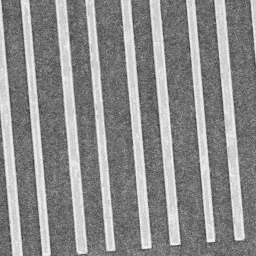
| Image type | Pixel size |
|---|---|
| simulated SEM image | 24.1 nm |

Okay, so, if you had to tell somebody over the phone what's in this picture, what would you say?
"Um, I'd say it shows parallel lines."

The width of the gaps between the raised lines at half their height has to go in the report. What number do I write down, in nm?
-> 530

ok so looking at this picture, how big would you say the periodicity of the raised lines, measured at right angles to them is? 767 nm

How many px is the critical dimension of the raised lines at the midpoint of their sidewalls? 7.1